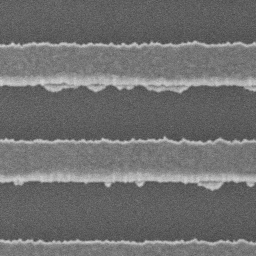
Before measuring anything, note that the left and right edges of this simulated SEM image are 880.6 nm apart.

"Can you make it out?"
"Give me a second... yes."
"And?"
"lines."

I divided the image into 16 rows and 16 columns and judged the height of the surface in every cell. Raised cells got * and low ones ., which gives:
................
................
................
****************
****************
................
................
................
................
****************
****************
................
................
................
................
****************